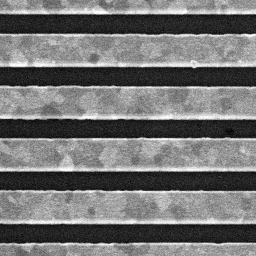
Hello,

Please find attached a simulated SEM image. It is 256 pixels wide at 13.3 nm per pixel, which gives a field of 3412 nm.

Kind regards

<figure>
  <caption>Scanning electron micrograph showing lines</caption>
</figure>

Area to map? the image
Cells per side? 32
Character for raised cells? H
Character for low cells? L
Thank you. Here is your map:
HHHHHHHHHHHHHHHHHHHHHHHHHHHHHHHH
HHHHHHHHHHHHHHHHHHHHHHHHHHHHHHHH
LLLLLLLLLLLLLLLLLLLLLLLLLLLLLLLL
LLLLLLLLLLLLLLLLLLLLLLLLLLLLLLLL
HHHHHHHHHHHHHHHHHHHHHHHHHHHHHHHH
HHHHHHHHHHHHHHHHHHHHHHHHHHHHHHHH
HHHHHHHHHHHHHHHHHHHHHHHHHHHHHHHH
HHHHHHHHHHHHHHHHHHHHHHHHHHHHHHHH
LLLLLLLLLLLLLLLLLLLLLLLLLLLLLLLL
LLLLLLLLLLLLLLLLLLLLLLLLLLLLLLLL
LLLLLLLLLLLLLLLLLLLLLLLLLLLLLLLL
HHHHHHHHHHHHHHHHHHHHHHHHHHHHHHHH
HHHHHHHHHHHHHHHHHHHHHHHHHHHHHHHH
HHHHHHHHHHHHHHHHHHHHHHHHHHHHHHHH
HHHHHHHHHHHHHHHHHHHHHHHHHHHHHHHH
LLLLLLLLLLLLLLLLLLLLLLLLLLLLLLLL
LLLLLLLLLLLLLLLLLLLLLLLLLLLLLLLL
HHHHHHHHHHHHHHHHHHHHHHHHHHHHHHHH
HHHHHHHHHHHHHHHHHHHHHHHHHHHHHHHH
HHHHHHHHHHHHHHHHHHHHHHHHHHHHHHHH
HHHHHHHHHHHHHHHHHHHHHHHHHHHHHHHH
LLLLLLLLLLLLLLLLLLLLLLLLLLLLLLLL
LLLLLLLLLLLLLLLLLLLLLLLLLLLLLLLL
LLLLLLLLLLLLLLLLLLLLLLLLLLLLLLLL
HHHHHHHHHHHHHHHHHHHHHHHHHHHHHHHH
HHHHHHHHHHHHHHHHHHHHHHHHHHHHHHHH
HHHHHHHHHHHHHHHHHHHHHHHHHHHHHHHH
HHHHHHHHHHHHHHHHHHHHHHHHHHHHHHHH
LLLLLLLLLLLLLLLLLLLLLLLLLLLLLLLL
LLLLLLLLLLLLLLLLLLLLLLLLLLLLLLLL
LLLLHLLHHHLLLLLLHHHHHHHHHHHLHHHH
HHHHHHHHHHHHHHHHHHHHHHHHHHHHHHHH